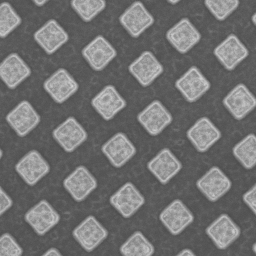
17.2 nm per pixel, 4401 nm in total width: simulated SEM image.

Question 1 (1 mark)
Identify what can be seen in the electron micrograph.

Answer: a regular array of raised bodies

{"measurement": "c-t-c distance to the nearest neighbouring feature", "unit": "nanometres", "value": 848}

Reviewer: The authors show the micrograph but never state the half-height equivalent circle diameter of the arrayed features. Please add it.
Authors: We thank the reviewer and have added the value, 493 nanometres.